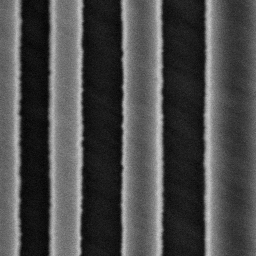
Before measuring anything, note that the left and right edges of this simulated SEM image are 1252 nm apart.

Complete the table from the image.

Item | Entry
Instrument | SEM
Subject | lines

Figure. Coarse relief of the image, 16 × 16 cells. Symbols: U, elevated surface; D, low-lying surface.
UDDUUDDDUUDDDUUU
UDDUUDDDUUDDDUUU
UDDUUDDDUUDDDUUU
UDDUUDDDUUDDDUUU
UDDUUDDDUUDDDUUU
UDDUUDDDUUDDDUUU
UDDUUDDDUUDDDUUU
UDDUUDDDUUDDDUUU
UDDUUDDDUUDDDUUU
UDDUUDDDUUDDDUUU
UDDUUDDDUUDDDUUU
UDDUUDDDUUDDDUUU
UDDUUDDDUUDDDUUU
UDDUUDDDUUDDDUUU
UDDUUDDDUUDDDUUU
UDDUUDDDUUDDDUUU